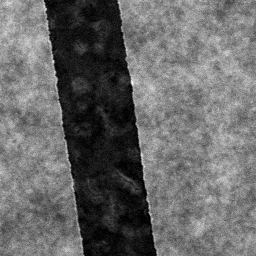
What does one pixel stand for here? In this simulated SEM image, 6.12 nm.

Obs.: one or a few lines or trenches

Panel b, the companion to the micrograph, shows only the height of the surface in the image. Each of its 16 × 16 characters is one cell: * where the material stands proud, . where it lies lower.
***....*********
***.....********
***.....********
***.....********
***.....********
****....********
****....********
****.....*******
****.....*******
****.....*******
****.....*******
*****....*******
*****....*******
*****....*******
*****.....******
*****.....******